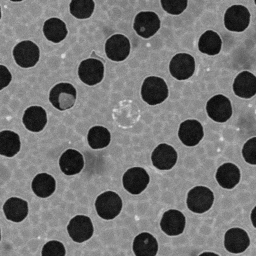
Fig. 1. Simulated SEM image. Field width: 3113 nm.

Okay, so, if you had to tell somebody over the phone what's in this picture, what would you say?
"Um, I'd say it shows a regular array of holes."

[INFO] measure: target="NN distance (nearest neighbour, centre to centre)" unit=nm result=444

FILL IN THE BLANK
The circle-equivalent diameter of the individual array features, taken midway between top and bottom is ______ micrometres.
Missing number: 0.331